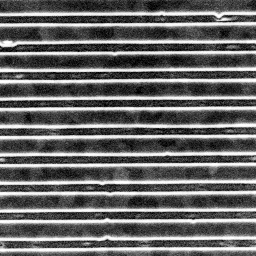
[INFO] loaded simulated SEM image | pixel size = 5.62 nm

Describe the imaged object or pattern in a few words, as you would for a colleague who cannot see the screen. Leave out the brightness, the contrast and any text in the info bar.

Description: parallel lines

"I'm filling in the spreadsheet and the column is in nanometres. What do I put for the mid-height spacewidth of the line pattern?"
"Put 52.7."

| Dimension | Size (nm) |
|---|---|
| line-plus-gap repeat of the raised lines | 158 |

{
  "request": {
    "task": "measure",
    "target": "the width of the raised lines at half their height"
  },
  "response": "106 nm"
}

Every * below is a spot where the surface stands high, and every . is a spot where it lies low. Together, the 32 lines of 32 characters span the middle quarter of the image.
********************************
********************************
................................
................................
********************************
********************************
********************************
********************************
********************************
................................
................................
********************************
********************************
********************************
********************************
******************....**********
................................
................................
********************************
********************************
********************************
********************************
*******************************.
................................
................................
********************************
********************************
********************************
********************************
********************************
................................
................................